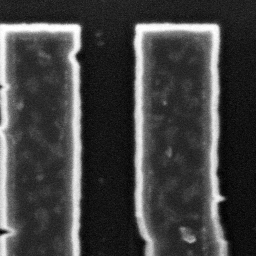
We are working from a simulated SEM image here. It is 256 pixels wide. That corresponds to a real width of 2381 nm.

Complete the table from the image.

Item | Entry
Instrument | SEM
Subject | one or a few lines or trenches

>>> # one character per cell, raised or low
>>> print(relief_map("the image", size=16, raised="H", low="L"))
LLLLLLLLLLLLLLLL
LLLLLLLLLLLLLLLL
HHHHHLLLLHHHHHLL
HHHHHLLLLHHHHLLL
HHHHHLLLLHHHHLLL
HHHHHLLLLHHHHLLL
HHHHHLLLLHHHHLLL
HHHHHLLLLHHHHLLL
HHHHHLLLLHHHHLLL
HHHHHLLLLHHHHLLL
HHHHHLLLLHHHHLLL
HHHHHLLLLHHHHLLL
HHHHHLLLLHHHHHLL
HHHHHLLLLHHHHLLL
HHHHHLLLLHHHHHLL
HHHHHLLLLHHHHHLL